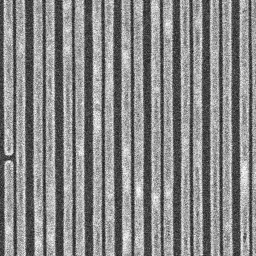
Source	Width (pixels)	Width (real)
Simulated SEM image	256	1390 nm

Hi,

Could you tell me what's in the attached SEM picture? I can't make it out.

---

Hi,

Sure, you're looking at parallel lines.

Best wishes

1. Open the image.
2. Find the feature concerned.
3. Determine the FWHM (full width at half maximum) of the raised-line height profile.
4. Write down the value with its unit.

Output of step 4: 46.2 nanometres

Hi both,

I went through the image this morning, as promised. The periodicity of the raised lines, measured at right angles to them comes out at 80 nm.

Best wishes